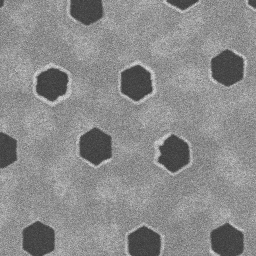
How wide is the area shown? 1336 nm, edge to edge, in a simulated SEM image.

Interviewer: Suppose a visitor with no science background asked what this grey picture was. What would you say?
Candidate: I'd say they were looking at holes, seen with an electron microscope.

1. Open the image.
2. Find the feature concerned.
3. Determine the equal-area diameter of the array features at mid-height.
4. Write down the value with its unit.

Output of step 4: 0.172 µm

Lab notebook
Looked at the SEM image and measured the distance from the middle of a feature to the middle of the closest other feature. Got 0.398 microns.